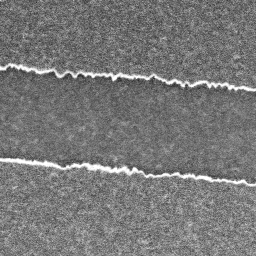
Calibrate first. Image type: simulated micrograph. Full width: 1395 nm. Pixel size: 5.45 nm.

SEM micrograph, one or a few lines or trenches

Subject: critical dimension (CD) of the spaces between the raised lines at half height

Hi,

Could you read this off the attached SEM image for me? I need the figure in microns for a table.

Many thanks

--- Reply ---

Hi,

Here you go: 0.502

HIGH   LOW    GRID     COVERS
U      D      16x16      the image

UUUUUUUUUUUUUUUU
UUUUUUUUUUUUUUUU
UUUUUUUUUUUUUUUU
UUUUUUUUUUUUUUUU
DDDUUUUUUUUUUUUU
DDDDDDDDDDDDDDDU
DDDDDDDDDDDDDDDD
DDDDDDDDDDDDDDDD
DDDDDDDDDDDDDDDD
DDDDDDDDDDDDDDDD
UUUUUUDDDDDDDDDD
UUUUUUUUUUUUUUUU
UUUUUUUUUUUUUUUU
UUUUUUUUUUUUUUUU
UUUUUUUUUUUUUUUU
UUUUUUUUUUUUUUUU